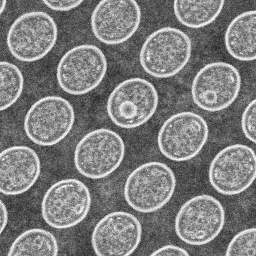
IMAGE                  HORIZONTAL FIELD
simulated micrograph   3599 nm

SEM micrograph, a regular array of raised bodies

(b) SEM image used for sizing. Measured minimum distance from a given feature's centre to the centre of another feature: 844 nanometers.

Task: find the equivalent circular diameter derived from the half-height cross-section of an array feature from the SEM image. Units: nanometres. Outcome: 651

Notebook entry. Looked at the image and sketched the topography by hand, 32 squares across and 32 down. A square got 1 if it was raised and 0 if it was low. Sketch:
00000011100001111000001111110000
00000000000011111000001111100000
00111100000011111000000111000111
00111110000011111000000000000111
01111110000011110001111000001111
01111100000000000011111000001111
00111100011100000011111100000111
00000000111110000011111000000000
11000001111110000011110000111000
11100001111110000000000001111100
11100000111100011100000011111100
11000000010000111110000011111100
11000111000000111110000001111000
00001111100000111110000000100001
00001111100000111110001100000001
00011111100000011000011111000011
00001111000011000000111111000001
00001110001111100000111111000000
00000000001111100000111110000110
11110000001111100000011100011111
11111000001111100001000000011111
11111000001111000111100000111111
11110000000000001111110000111110
11100001111000001111110000011110
00000011111000001111100000000000
00000111111000001111000111100000
10000011111000000000000111110000
10000011110001111000001111110000
00000000000011111000001111100000
00011100000011111000000111100011
00111110000011111000000000000111
01111110000011110000111000000111